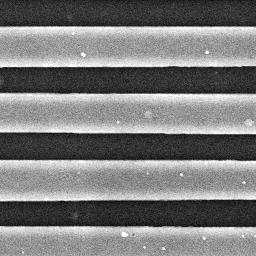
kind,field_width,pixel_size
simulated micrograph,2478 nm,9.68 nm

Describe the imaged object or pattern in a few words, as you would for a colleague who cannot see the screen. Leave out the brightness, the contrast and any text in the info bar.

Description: lines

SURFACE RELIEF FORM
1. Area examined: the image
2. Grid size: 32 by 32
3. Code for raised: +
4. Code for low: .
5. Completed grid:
................................
................................
................................
++++++++++++++++++++++++++++++++
++++++++++++++++++++++++++++++++
++++++++++++++++++++++++++++++++
++++++++++++++++++++++++++++++++
++++++++++++++++++++++++++++++++
................................
................................
................................
................................
++++++++++++++++++++++++++++++++
++++++++++++++++++++++++++++++++
++++++++++++++++++++++++++++++++
++++++++++++++++++++++++++++++++
.........+++++++++++++++++++++++
................................
................................
................................
++++++++++++++++++++++++++++++++
++++++++++++++++++++++++++++++++
++++++++++++++++++++++++++++++++
++++++++++++++++++++++++++++++++
++++++++++++++++++++++++++++++++
................................
................................
................................
++++++++++++++++++++++++++++++++
++++++++++++++++++++++++++++++++
++++++++++++++++++++++++++++++++
++++++++++++++++++++++++++++++++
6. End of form